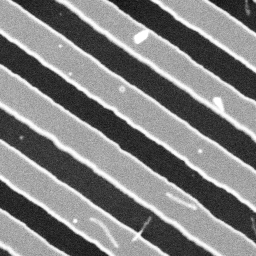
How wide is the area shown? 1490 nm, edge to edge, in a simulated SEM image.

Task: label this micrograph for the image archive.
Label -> lines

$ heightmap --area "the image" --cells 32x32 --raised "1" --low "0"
11000000111111000000111111100000
11100000011111100000011111110000
11111000000111111000001111111100
11111100000011111100000011111110
11111111000001111111000001111111
00111111100000011111100000011111
00011111111000001111111000001111
00000111111100000011111100000011
10000011111110000001111111000001
11000000111111100000111111100000
11110000011111110000001111110000
11111000001111111100000011111100
11111110000011111110000001111111
11111111000001111111100000111111
00111111100000011111110000001111
00011111111000001111111000000111
00000111111100000011111110000001
00000001111111000001111111000000
11000001111111100000011111110000
11100000011111111000001111111000
11111000000111111100000111111110
11111100000011111110000001111111
11111110000001111111100000111111
01111111100000011111110000001111
00011111110000001111111100000111
00001111111100000011111110000001
10000011111110000001111111000000
11000001111111100000011111100000
11110000011111110000001111111000
11111000001111111100000111111110
11111100000011111110000001111111
01111111000001111111000000111111